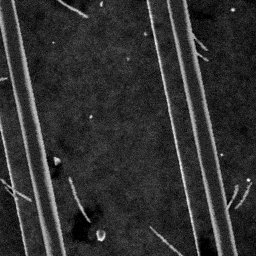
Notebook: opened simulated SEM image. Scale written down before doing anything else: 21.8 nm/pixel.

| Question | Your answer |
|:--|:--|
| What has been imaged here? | lines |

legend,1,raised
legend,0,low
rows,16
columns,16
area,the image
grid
1000000001110000
1000000001110000
1000000000110000
1100000000110000
1100000000111000
1100000000111000
1100000000011000
1100000000011000
1110000000011000
1110000000011100
0110000000011100
0110000000001100
0110000000001100
0111000000001100
0111000000001110
0011000000001110